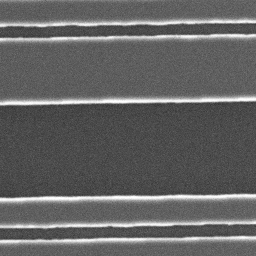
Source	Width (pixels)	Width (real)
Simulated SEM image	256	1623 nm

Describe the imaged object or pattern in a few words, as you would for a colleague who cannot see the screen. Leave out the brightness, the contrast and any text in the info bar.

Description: lines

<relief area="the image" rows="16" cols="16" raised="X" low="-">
XXXXXXXXXXXXXXXX
XXXXXXXXXXXXXXXX
XXXXXXXXXXXXXXXX
XXXXXXXXXXXXXXXX
XXXXXXXXXXXXXXXX
XXXXXXXXXXXXXXXX
----------------
----------------
----------------
----------------
----------------
----------------
-XXXXXXXXXXXXXXX
XXXXXXXXXXXXXXXX
XXXXXXXXXXXXXXXX
XXXXXXXXXXXXXXXX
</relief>